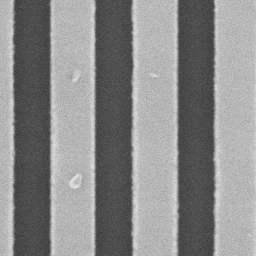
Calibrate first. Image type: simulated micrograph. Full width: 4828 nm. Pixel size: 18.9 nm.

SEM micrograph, lines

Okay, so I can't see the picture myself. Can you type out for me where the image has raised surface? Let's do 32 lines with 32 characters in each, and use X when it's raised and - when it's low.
XX----XXXXXX-----XXXXX-----XXXXX
XX----XXXXXX-----XXXXX-----XXXXX
XX----XXXXXX-----XXXXX-----XXXXX
XX----XXXXXX-----XXXXX-----XXXXX
XX----XXXXXX-----XXXXX-----XXXXX
XX----XXXXXX-----XXXXX-----XXXXX
XX----XXXXXX-----XXXXX-----XXXXX
XX----XXXXXX-----XXXXX-----XXXXX
XX----XXXXXX-----XXXXX-----XXXXX
XX----XXXXXX-----XXXXX-----XXXXX
XX----XXXXXX-----XXXXX-----XXXXX
XX----XXXXXX-----XXXXX-----XXXXX
XX----XXXXXX-----XXXXX-----XXXXX
XX----XXXXXX-----XXXXX-----XXXXX
XX----XXXXXX-----XXXXX-----XXXXX
XX-----XXXXX-----XXXXX-----XXXXX
XX----XXXXXX-----XXXXX-----XXXXX
XX----XXXXXX-----XXXXX-----XXXXX
XX----XXXXXX-----XXXXX-----XXXXX
XX-----XXXXX-----XXXXX-----XXXXX
XX----XXXXXX-----XXXXX-----XXXXX
XX----XXXXXX-----XXXXX-----XXXXX
XX----XXXXXX-----XXXXX-----XXXXX
XX----XXXXXX-----XXXXX-----XXXXX
XX----XXXXXX-----XXXXX-----XXXXX
XX----XXXXXX-----XXXXX-----XXXXX
XX----XXXXXX-----XXXXX-----XXXXX
XX----XXXXXX-----XXXXX-----XXXXX
XX----XXXXXX-----XXXXX-----XXXXX
XX----XXXXXX-----XXXXX-----XXXXX
XX----XXXXXX-----XXXXX-----XXXXX
XX----XXXXXX-----XXXXX-----XXXXX